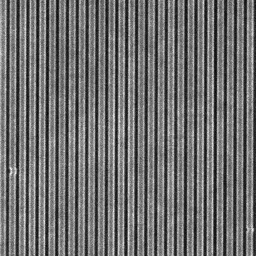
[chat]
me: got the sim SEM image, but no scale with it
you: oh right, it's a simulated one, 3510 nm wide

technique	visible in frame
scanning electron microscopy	parallel lines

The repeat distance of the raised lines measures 136 nm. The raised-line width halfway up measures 82.2 nm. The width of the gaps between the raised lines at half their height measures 0.0548 µm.